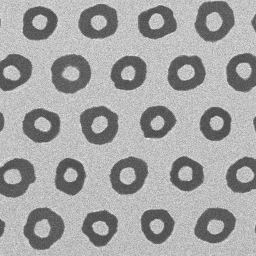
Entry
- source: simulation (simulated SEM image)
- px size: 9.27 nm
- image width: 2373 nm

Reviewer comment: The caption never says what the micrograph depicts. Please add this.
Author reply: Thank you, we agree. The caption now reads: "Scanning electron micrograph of a regular array of ring-shaped grooves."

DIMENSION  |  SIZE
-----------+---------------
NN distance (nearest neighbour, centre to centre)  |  530 nm